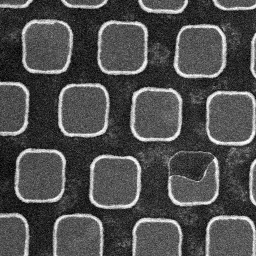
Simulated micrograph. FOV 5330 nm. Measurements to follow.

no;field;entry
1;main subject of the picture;a regular array of raised bodies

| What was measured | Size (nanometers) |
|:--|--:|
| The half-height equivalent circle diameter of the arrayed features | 1120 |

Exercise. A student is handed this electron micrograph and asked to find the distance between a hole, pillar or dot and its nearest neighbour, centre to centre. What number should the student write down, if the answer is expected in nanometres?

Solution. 1530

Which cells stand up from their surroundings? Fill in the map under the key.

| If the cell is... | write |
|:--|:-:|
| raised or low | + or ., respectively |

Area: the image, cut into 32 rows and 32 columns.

+++.....+++++.....+++++....+++++
.....................+..........
................................
...++++++....+++++.....++++.....
...++++++...++++++....++++++....
...++++++...++++++....++++++....
...++++++...++++++....++++++....
...++++++...++++++....++++++....
...+++++.....+++++....++++++....
.......................++++.....
++..............................
+++.....+++++....+++++.....+....
+++.....+++++....++++++...++++++
+++.....+++++....++++++...++++++
+++....++++++....++++++...++++++
+++....++++++....++++++...++++++
++......+++++....+++++....++++++
..................+........++++.
................................
...+++++........................
..++++++....+++++.........+.....
..++++++...++++++.........+....+
..++++++...++++++....+++.++....+
..++++++...++++++....++++++....+
..+++++....++++++....++++++....+
............+++++...............
................................
+++....+++++......+........++++.
+++....++++++....+++++....++++++
+++....++++++....++++++...++++++
+++....++++++....++++++...++++++
+++....++++++....++++++...++++++